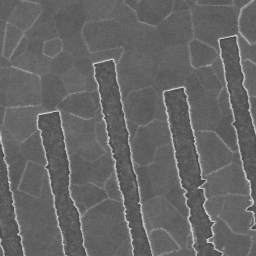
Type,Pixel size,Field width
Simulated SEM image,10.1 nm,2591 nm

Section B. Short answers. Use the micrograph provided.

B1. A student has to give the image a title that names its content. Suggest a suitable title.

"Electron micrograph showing one or a few lines or trenches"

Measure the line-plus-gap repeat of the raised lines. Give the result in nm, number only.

645